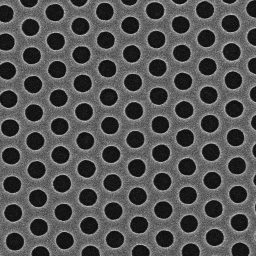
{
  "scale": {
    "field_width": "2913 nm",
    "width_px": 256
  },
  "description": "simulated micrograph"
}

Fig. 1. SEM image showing a regular array of holes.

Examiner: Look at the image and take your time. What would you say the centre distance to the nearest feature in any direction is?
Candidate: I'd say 0.322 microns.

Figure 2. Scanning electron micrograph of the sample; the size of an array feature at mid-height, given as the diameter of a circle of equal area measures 204 nm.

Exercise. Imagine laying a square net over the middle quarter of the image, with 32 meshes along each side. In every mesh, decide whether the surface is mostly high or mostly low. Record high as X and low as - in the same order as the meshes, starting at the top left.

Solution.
XXXXXXXXX----XXXXXXXX-----XXXXXX
-XXXXXXXX----XXXXXXXX-----XXXXXX
XXXXXXXXX----XXX--XXXX---XXX---X
XXX----XXXXXXXX----XXXXXXXXX----
XX-----XXXXXXXX-----XXXXXXX-----
XX-----XXXXXXXX----XXXXXXXXX----
XXX---XXXX--XXXX--XXXX---XXXX--X
-XXXXXXXX----XXXXXXXX-----XXXXXX
-XXXXXXXX-----XXXXXXX-----XXXXXX
-XXXXXXXX----XXXXXXXXX---XXXX--X
XXX----XXXXXXXXX---XXXXXXXXX----
XXX----XXXXXXXX-----XXXXXXXX----
XXX----XXXXXXXX-----XXXXXXXX----
XXX----XXX---XXX---XXXX---XXX--X
-XXXXXXXX-----XXXXXXXX----XXXXXX
-XXXXXXXX-----XXXXXXXX----XXXXXX
-XXXXXXXXX----XXXXXXXX----XXXX-X
XXXX---XXXX-XXXX----XXXXXXXX----
XXX-----XXXXXXXX----XXXXXXXX----
XXX-----XXXXXXXX----XXXXXXXX----
XXXX---XXXX-XXXX---XXXX---XXX--X
-XXXXXXXXX----XXXXXXXX----XXXXXX
-XXXXXXXXX----XXXXXXXX-----XXXXX
-XXXXXXXXX----XXXXXXXX----XXXXXX
XXXX---XXXX--XXX----XXXX-XXXX---
XXX-----XXXXXXXX----XXXXXXXX----
XXX-----XXXXXXXX----XXXXXXXXX---
XXXX---XXXXXXXXXX---XXX---XXXX--
-XXXXXXXXX----XXXXXXXXX----XXXXX
--XXXXXXXX----XXXXXXXX-----XXXXX
--XXXXXXXX----XXXXXXXXX---XXXXXX
-XXXX--XXXX--XXXX---XXXX--XXX---